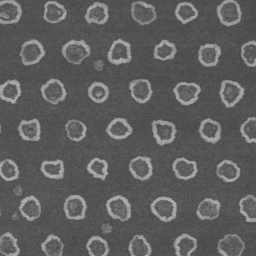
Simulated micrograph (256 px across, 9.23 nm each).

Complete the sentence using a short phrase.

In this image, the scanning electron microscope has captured a regular array of raised bodies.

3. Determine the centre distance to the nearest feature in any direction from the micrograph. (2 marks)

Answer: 400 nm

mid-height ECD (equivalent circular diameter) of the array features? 207 nm